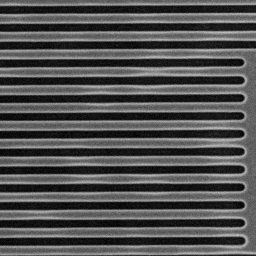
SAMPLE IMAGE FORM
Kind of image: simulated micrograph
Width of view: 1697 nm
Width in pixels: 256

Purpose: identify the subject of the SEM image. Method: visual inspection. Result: groups of lines, slits or small figures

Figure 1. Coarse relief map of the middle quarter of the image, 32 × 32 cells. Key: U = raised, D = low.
DDDDDDDDDDDDDDDDDDDDDDDDDDDDDDDD
UUUUUUUUUUUUUUUUUUUUUUUUUUUUUUUU
UUUUUUUUUUUUUUUUUUUUUUUUUUUUUUUU
DDDDDDDDDDDDDDDDDDDDDDDDDDDDDDDD
DDDDDDDDDDDDDDDDDDDDDDDDDDDDDDDD
UUUUUUUDDDDUUUUUUUDDDDDDUUUUUUUU
UUUUUUUUUUUUUUUUUUUUUUUUUUUUUUUU
UUUUUUDDDDDDUUUUUDDDDDDDUUUUUUUU
DDDDDDDDDDDDDDDDDDDDDDDDDDDDDDDD
DDDDDDDDDDDDDDDDDDDDDDDDDDDDDDDD
UUUUUUUUUUUUUUUUUUUUUUUUUUUUUUUU
UUUUUUUUUUUUUUUUUUUUUUUUUUUUUUUU
DDDDDDDDDDDDDDDDDDDDDDDDDDDDDDDD
DDDDDDDDDDDDDDDDDDDDDDDDDDDDDDDD
UUUUUUUUUUUUUUUUUUUUUUUUUUUUUUUU
UUUUUUUUUUUUUUUUUUUUUUUUUUUUUUUU
UUUUUUUUUUUUUUUUUUUUUUUUDDDDDDDD
DDDDDDDDDDDDDDDDDDDDDDDDDDDDDDDD
DDDDDDDDDDDDDDDDDDDDDDDDDDDDDDDD
UUUUUUUUUUUUUUUUUUUUUUUUUUUUUUUU
UUUUUUUUUUUUUUUUUUUUUUUUUUUUUUUU
DDDDDDDDDDDDDDDDDDDDDDDDDDDDDDDD
DDDDDDDDDDDDDDDDDDDDDDDDDDDDDDDD
UUDDDUUUUUUUUUUUUUUUUUUUUUUUUUUU
UUUUUUUUUUUUUUUUUUUUUUUUUUUUUUUU
DDDDDDDDDDDDDDDDDDDDDDDDDDDDDDDD
DDDDDDDDDDDDDDDDDDDDDDDDDDDDDDDD
DDDDDDDDDDDDDDDDDDDDDDDDDDDDDDDD
UUUUUUUUUUUUUUUUUUUUUUUUUUUUUUUU
UUUUUUUUUUUUUUUUUUUUUUUUUUUUUUUU
DDDDDDDDDDDDDDDDDDDDDDDDDDDDDDDD
DDDDDDDDDDDDDDDDDDDDDDDDDDDDDDDD